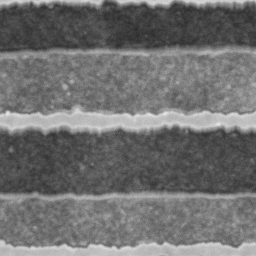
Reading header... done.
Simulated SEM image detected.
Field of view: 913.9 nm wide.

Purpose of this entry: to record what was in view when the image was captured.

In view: lines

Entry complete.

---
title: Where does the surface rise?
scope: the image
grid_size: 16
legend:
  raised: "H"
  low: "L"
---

LLLLLLLLLLLLLLLL
LLLLLLLLLLLLLLLL
LLLLLLLLLLLLLLLL
HHHHHHHHHHHHHHHH
HHHHHHHHHHHHHHHH
HHHHHHHHHHHHHHHH
HHHHHHHHHHHHHHHH
HHHHHHHHHHHHHHHH
LLLLLLLLLLLLLLLL
LLLLLLLLLLLLLLLL
LLLLLLLLLLLLLLLL
LLLLLLLLLLLLLLLL
HHHHHHHHHHHHHHHH
HHHHHHHHHHHHHHHH
HHHHHHHHHHHHHHHH
HHHHHHHHHHHHHHHH